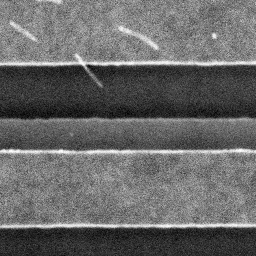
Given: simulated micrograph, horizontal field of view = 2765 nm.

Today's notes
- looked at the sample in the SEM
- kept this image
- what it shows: lines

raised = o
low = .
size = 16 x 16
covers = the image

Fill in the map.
oooooooooooooooo
oooooooooooooooo
oooooooooooooooo
oooooooooooooooo
................
................
................
.....oooooooo.oo
oooooooooooooooo
oooooooooooooooo
oooooooooooooooo
oooooooooooooooo
oooooooooooooooo
oooooooooooooooo
................
................